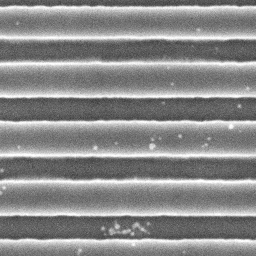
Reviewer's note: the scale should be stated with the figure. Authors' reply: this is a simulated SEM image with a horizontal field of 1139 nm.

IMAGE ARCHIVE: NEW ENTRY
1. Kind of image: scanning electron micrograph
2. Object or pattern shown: lines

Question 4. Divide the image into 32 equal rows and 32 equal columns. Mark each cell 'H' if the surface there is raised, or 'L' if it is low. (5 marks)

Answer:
LLLLLLLLLLLLLLLLLLLLLLLLLLLLLLLL
HHHHHHHHHHHHHHHHHHHHHHHHHHHHHHHH
HHHHHHHHHHHHHHHHHHHHHHHHHHHHHHHH
HHHHHHHHHHHHHHHHHHHHHHHHHHHHHHHH
HHHHHHHHHHHHHHHHHHHHHHHHHHHHHHHH
LLLLLLLLLLLLLLLLLLLLLLLLLLLLLLLL
LLLLLLLLLLLLLLLLLLLLLLLLLLLLLLLL
LLLLLLLLLLLLLLLLLLLLLLLLLLLLLLLL
HHHHHHHHHHHHHHHHHHHHHHHHHHHHHHHH
HHHHHHHHHHHHHHHHHHHHHHHHHHHHHHHH
HHHHHHHHHHHHHHHHHHHHHHHHHHHHHHHH
HHHHHHHHHHHHHHHHHHHHHHHHHHHHHHHH
LLLLLLLLLLLLLLLLLLLLLLLLLLLLLLLL
LLLLLLLLLLLLLLLLLLLLLLLLLLLLLLLL
LLLLLLLLLLLLLLLLLLLLLLLLLLLLLLLL
HHHHHHHHHHHHHHHHHHHHHHHHHHHHHHHH
HHHHHHHHHHHHHHHHHHHHHHHHHHHHHHHH
HHHHHHHHHHHHHHHHHHHHHHHHHHHHHHHH
HHHHHHHHHHHHHHHHHHHHHHHHHHHHHHHH
HLLLHHHHLLLLLLHHHHLHHHHHHHHHHHHH
LLLLLLLLLLLLLLLLLLLLLLLLLLLLLLLL
LLLLLLLLLLLLLLLLLLLLLLLLLLLLLLLL
LLLLLLLLLLLLLLLLLLLLLLLLLLLLLLLL
HHHHHHHHHHHHHHHHHHHHHHHHHHHHHHHH
HHHHHHHHHHHHHHHHHHHHHHHHHHHHHHHH
HHHHHHHHHHHHHHHHHHHHHHHHHHHHHHHH
HHHHHHHHHHHHHHHHHHHHHHHHHHHHHHHH
LLLLLLLLLLLLLLLLLLLLLLLLLLLLLLLL
LLLLLLLLLLLLLLLLLLLLLLLLLLLLLLLL
LLLLLLLLLLLLLLLLLLLLLLLLLLLLLLLL
HHHHHHHHHHHHHHHHHHHHHHHHHHHHHHHH
HHHHHHHHHHHHHHHHHHHHHHHHHHHHHHHH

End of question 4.